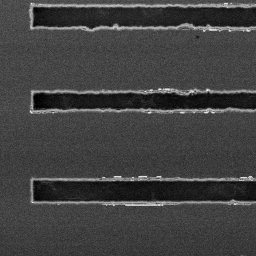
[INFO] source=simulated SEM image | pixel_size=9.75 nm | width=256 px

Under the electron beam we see one or a few lines or trenches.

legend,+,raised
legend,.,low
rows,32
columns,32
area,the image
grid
++++++++++++++++++++++++++++++++
++++............................
++++............................
++++++...++.+.+...+..++++++.+...
++++++++++++++++++++++++++++++++
++++++++++++++++++++++++++++++++
++++++++++++++++++++++++++++++++
++++++++++++++++++++++++++++++++
++++++++++++++++++++++++++++++++
++++++++++++++++++++++++++++++++
++++++++++++++++++++++++++++++++
+++++....++++....++...++........
++++............................
++++............................
++++++++++++++++++++++++++++++++
++++++++++++++++++++++++++++++++
++++++++++++++++++++++++++++++++
++++++++++++++++++++++++++++++++
++++++++++++++++++++++++++++++++
++++++++++++++++++++++++++++++++
++++++++++++++++++++++++++++++++
++++++++++++++++++++++++++++++++
++++........++++++..+........+++
++++............................
++++............................
++++++++++++++++++++++++++++++++
++++++++++++++++++++++++++++++++
++++++++++++++++++++++++++++++++
++++++++++++++++++++++++++++++++
++++++++++++++++++++++++++++++++
++++++++++++++++++++++++++++++++
++++++++++++++++++++++++++++++++